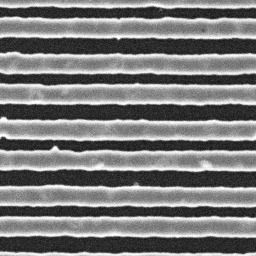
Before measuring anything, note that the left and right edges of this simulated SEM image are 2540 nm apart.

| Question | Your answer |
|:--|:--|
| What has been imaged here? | parallel lines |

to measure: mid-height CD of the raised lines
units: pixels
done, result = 18.9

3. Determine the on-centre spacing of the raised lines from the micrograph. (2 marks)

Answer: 0.329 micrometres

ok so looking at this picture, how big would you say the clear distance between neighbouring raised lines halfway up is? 143 nm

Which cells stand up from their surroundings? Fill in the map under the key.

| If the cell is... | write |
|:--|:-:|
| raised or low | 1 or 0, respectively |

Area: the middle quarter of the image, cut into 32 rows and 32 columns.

11111111111111111111111111111111
11111111111111111111111111111111
00000000000000000000000100001111
00000000000000000000000000000000
00000000000000000000000000000000
11111111111111111111111111111111
11111111111111111111111111111111
11111111111111111111111111111111
11111111111111111111111111111111
11111111111111111111111111111111
00000000000000000000000000000000
00000000000000000000000000000000
00000000000000000000000000000000
00000000000000000000000000000000
11111111111111111111111111111110
11111111111111111111111111111111
11111111111111111111111111111111
11111111111111111111111111111111
11111111111111111111111111111111
00000000000000000000000000000000
00000000000000000000000000000000
00000000000000000000000000000000
11111111111111111111111111111111
11111111111111111111111111111111
11111111111111111111111111111111
11111111111111111111111111111111
00000011000000100110000000000001
00000000000000000000000000000000
00000000000000000000000000000000
00000000000000000000000000000000
00000000000000000000000000000000
11111111111111111111111111111111